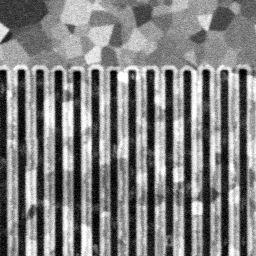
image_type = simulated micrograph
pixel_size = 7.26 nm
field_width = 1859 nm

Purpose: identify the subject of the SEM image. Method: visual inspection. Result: parallel lines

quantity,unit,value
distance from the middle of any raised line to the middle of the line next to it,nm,134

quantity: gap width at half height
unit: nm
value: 67.1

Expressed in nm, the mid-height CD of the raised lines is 67.1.